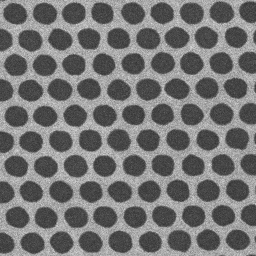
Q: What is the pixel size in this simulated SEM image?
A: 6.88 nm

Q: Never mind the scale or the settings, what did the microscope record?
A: a regular array of holes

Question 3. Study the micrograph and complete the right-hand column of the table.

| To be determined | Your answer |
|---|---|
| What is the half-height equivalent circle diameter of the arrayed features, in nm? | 156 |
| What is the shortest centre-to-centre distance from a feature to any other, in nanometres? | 198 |